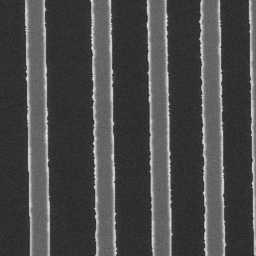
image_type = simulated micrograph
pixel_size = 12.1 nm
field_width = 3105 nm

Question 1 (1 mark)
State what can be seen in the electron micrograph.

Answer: lines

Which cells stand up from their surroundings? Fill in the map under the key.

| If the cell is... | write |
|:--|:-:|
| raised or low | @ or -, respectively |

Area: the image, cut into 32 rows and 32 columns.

---@@@-----@@@----@@@----@@----@
---@@@-----@@@----@@@----@@----@
---@@@-----@@@-----@@----@@----@
---@@@-----@@@----@@@----@@@---@
---@@@-----@@@-----@@----@@@---@
---@@@-----@@@-----@@----@@@---@
---@@@------@@-----@@----@@@---@
---@@@------@@-----@@----@@@---@
---@@@------@@-----@@----@@@---@
---@@@------@@-----@@----@@@---@
---@@@------@@-----@@----@@@---@
---@@@------@@-----@@----@@@---@
---@@@------@@-----@@----@@@---@
---@@@------@@-----@@----@@@---@
---@@@------@@-----@@----@@@---@
----@@------@@-----@@----@@@---@
----@@------@@-----@@----@@@---@
----@@------@@-----@@----@@@----
----@@------@@-----@@----@@@----
----@@------@@-----@@----@@@----
----@@------@@-----@@----@@@----
----@@------@@-----@@----@@@----
----@@------@@-----@@----@@@----
----@@------@@-----@@-----@@----
----@@------@@-----@@----@@@----
----@@------@@-----@@-----@@----
----@@------@@-----@@-----@@----
----@@------@@-----@@-----@@----
----@@------@@-----@@-----@@----
----@@------@@-----@@-----@@----
----@@------@@-----@@-----@@----
----@@------@@@----@@-----@@----